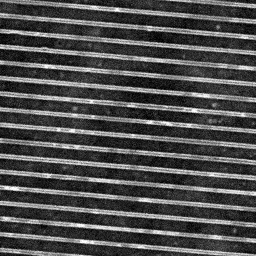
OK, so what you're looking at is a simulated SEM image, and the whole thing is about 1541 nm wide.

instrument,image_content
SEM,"parallel lines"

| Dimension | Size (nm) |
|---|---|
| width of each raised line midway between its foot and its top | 20.2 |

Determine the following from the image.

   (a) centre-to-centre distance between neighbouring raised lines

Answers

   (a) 15.6 pixels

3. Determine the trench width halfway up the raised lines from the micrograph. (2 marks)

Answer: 71.2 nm